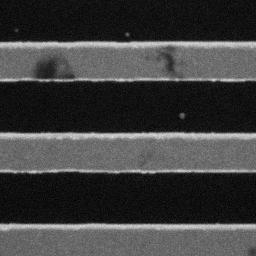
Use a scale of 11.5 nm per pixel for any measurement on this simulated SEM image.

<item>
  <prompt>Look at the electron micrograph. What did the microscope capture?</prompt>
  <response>lines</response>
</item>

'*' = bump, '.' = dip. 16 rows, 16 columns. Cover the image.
................
................
................
****************
****************
................
................
................
****************
****************
****************
................
................
................
****************
****************